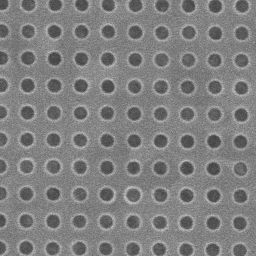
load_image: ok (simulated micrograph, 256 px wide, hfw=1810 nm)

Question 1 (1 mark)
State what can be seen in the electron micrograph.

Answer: a regular array of holes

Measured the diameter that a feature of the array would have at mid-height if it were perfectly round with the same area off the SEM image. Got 14.1 px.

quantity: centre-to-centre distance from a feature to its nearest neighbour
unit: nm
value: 187